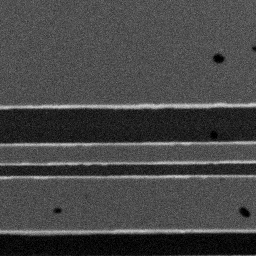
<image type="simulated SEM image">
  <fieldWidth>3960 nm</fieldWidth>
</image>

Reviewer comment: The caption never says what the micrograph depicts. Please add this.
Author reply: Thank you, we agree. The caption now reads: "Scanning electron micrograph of lines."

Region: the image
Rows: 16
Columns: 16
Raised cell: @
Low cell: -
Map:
@@@@@@@@@@@@@@@@
@@@@@@@@@@@@@@@@
@@@@@@@@@@@@@@@@
@@@@@@@@@@@@@@@@
@@@@@@@@@@@@@@@@
@@@@@@@@@@@@@@@@
@@@@@@@@@@@@@@@@
----------------
----------------
@@@@@@@@@@@@@@@@
@@@@@@@@@@@@@@@@
@@@@@@@@@@@@@@@@
@@@@@@@@@@@@@@@@
@@@@@@@@@@@@@@@@
-@--------------
----------------